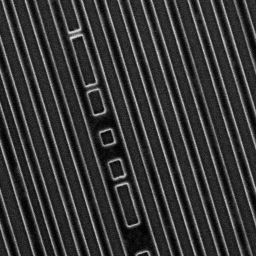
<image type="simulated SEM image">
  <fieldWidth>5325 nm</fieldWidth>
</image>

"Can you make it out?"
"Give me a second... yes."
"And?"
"parallel lines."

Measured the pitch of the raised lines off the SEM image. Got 461 nm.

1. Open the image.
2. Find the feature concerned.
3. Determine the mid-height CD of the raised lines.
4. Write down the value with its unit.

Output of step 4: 224 nm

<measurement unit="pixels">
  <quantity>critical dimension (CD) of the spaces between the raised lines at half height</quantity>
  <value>11.8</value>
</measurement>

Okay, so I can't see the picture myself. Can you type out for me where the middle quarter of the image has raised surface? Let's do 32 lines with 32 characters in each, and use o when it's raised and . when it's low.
.ooo...oo....oo....oo...ooo...oo
.ooo...ooo...ooo...oo....oo...oo
..oo....oo...ooo...ooo...ooo...o
..ooo...oo....oo...ooo...ooo...o
..ooo...ooo...ooo...oo...ooo...o
...oooooooo...ooo...ooo...ooo..o
...oooooooo...ooo...ooo...ooo...
...ooo...ooo...ooo...oo...ooo...
...ooo...ooo...ooo...ooo...oo...
o...ooo...oo...ooo...ooo...ooo..
o...ooo...ooo...oo....oo...ooo..
o...ooo...ooo...ooo...oo....oo..
oo...ooo.oooo...ooo...ooo...ooo.
oo...oooooooo....oo...ooo...ooo.
oo...ooooooooo...ooo...oo...ooo.
oo....oooooooo...ooo...ooo...ooo
ooo...ooooo.oo...ooo...ooo...ooo
ooo...ooo...ooo...ooo...oo...ooo
.oo...ooo...ooo...ooo...ooo...oo
.ooo...ooo..ooo...ooo...ooo...oo
.ooo...ooooooooo...oo...ooo...oo
..oo...ooooooooo...ooo...oo....o
..ooo...oooooooo...ooo...ooo...o
..ooo...oooooooo....oo...ooo...o
...oo...oooo..ooo...ooo...oo....
...oo....oo....oo...ooo...ooo...
...ooo...ooo...oo...ooo...ooo...
...ooo...ooo...ooo...ooo..ooo...
o...oo...ooo.ooooo...ooo...ooo..
o...ooo...oooooooo...ooo...ooo..
o...ooo...ooo...ooo...ooo..ooo..
oo...oo...ooo...ooo...ooo...ooo.